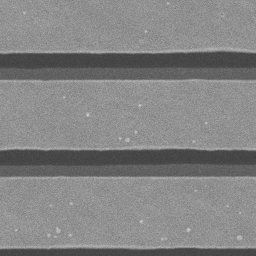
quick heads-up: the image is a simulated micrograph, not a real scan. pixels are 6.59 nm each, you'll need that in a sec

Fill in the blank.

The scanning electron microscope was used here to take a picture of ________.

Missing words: lines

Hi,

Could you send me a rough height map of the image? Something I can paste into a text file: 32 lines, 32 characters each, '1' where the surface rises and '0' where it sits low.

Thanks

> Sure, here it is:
11111111111111111111111111111111
11111111111111111111111111111111
11111111111111111111111111111111
11111111111111111111111111111111
11111111111111111111111111111111
11111111111111111111111111111111
11111111111111111111111100000011
00000000000000000000000000000000
00000001000000000000001000000000
11111111111111111111111111111111
11111111111111111111111111111111
11111111111111111111111111111111
11111111111111111111111111111111
11111111111111111111111111111111
11111111111111111111111111111111
11111111111111111111111111111111
11111111111111111111111111111111
11111111111111111111111111111111
11111111111111111111111111111111
00000000000000000000000000000000
00000000000000000000000000000000
11111111111111111111111111111111
11111111111111111111111111111111
11111111111111111111111111111111
11111111111111111111111111111111
11111111111111111111111111111111
11111111111111111111111111111111
11111111111111111111111111111111
11111111111111111111111111111111
11111111111111111111111111111111
11111111111111111111111111111111
00000000000000000000000000000000